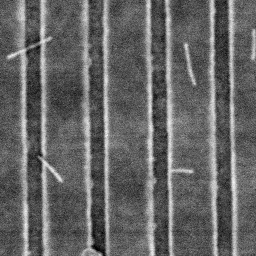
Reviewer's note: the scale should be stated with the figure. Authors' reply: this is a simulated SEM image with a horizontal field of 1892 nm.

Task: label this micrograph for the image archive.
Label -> lines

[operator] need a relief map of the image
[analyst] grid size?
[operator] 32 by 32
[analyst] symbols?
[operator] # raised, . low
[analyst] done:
###..######..######..######..###
###..######..######..######..###
###..######..######..######..###
###..######..######..######..###
###..######..######..######..###
###..######..######..######..###
###..######..######..######..###
###..######..######..######..###
###..######..######..######..###
###..######..######..######..###
###..######..######..######..###
###..######..######..######..###
###..######..######..######..###
###..######..######..######..###
###..######..######..######..###
###..######..######..######..###
###..######..######..######..###
###..######..######..######..###
###..######..######..######..###
###..######..######..######..###
###..######..######..######..###
###..######..######..######..###
###...#####..######..######..###
###...#####..######..######..###
###...#####..######..######..###
###...#####..######..######..###
###...#####..######..######..###
###...#####..######..######..###
###...#####..######..######..###
###...#####..######..######..###
###...#####..######..######..###
###...######.######..######..###